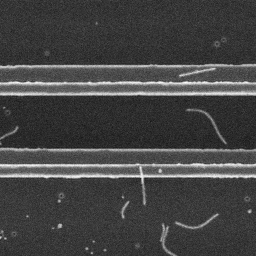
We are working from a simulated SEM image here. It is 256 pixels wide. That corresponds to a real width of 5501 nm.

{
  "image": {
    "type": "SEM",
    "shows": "lines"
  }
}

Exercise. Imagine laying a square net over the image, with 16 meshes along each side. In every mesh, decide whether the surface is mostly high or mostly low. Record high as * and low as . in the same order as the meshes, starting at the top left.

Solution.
................
................
................
................
****************
****************
................
................
................
****************
****************
................
................
................
................
................